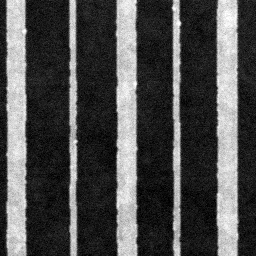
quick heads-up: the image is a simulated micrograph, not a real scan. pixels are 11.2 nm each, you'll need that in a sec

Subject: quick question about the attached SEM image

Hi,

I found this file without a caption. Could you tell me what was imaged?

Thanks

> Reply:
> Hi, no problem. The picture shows lines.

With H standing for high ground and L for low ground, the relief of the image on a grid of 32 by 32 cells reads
LHHLLLLLLLLLLLLHHLLLLLLLLLLHHHLL
LHHLLLLLLLLLLLLHHLLLLLLLLLLHHHLL
LHHLLLLLLLLLLLLHHLLLLLLLLLLHHLLL
LHHLLLLLLLLLLLLHHLLLLLLLLLLHHHLL
LHHLLLLLLLLLLLLHHLLLLLLLLLLHHHLL
LHHLLLLLLLLLLLLHHLLLLLLLLLLHHHLL
LHHLLLLLLLLLLLLHHLLLLLLLLLLHHHLL
LHHLLLLLLLLLLLLHHLLLLLLLLLLHHHLL
LHHLLLLLLLLLLLLHHLLLLLLLLLLHHHLL
LHHLLLLLLLLLLLLHHLLLLLLLLLLHHHLL
LHHLLLLLLLLLLLLHHLLLLLLLLLLHHHLL
LHHLLLLLLLLLLLLHHLLLLLLLLLLHHHLL
LHHLLLLLLLLLLLLHHLLLLLLLLLLHHHLL
LHHLLLLLLLLLLLLHHLLLLLLLLLLHHHLL
LHHLLLLLLLLLLLLHHLLLLLLLLLLHHHLL
LHHLLLLLLLLLLLLHHLLLLLLLLLLHHHLL
LHHLLLLLLLLLLLLHHLLLLLLLLLLHHHLL
LHHLLLLLLHLLLLLHHLLLLLLLLLLHHHLL
LHHLLLLLLLLLLLLHHLLLLLLLLLLHHHLL
LHHLLLLLLLLLLLLHHLLLLLLLLLLHHHLL
LHHLLLLLLLLLLLLHHLLLLLLLLLLHHHLL
LHHLLLLLLLLLLLLHHLLLLLLLLLLHHHLL
LHHLLLLLLLLLLLLHHLLLLLLLLLLHHHLL
LHHLLLLLLLLLLLLHHLLLLLLLLLLHHHLL
LHHLLLLLLLLLLLLHHLLLLLLLLLLHHHLL
LHHLLLLLLLLLLLLHHLLLLLLLLLLHHHLL
LHHLLLLLLLLLLLLHHLLLLLLLLLLHHHLL
LHHLLLLLLLLLLLLHHLLLLLLLLLLHHHLL
LHHLLLLLLLLLLLLHHLLLLLLLLLLHHHLL
LHHLLLLLLLLLLLLHHLLLLLLLLLLHHHLL
LHHLLLLLLLLLLLLHHLLLLLLLLLLHHHLL
LHHLLLLLLLLLLLLHHLLLLLLLLLLHHHLL